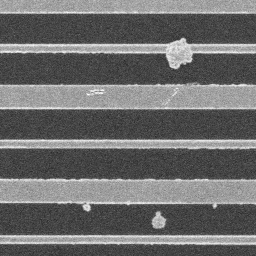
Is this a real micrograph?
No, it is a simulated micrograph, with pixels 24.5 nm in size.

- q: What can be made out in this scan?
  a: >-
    lines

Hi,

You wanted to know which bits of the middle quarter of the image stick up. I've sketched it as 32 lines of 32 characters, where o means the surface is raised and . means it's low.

...........................oo...
................................
................................
................................
................................
oooooooooooooooooooooooooooooooo
oooooooooooooooooooooooooooooooo
oooooooooooooooooooooooooooooooo
oooooooooooooooooooooooooooooooo
oooooooooooooooooooooooooooooooo
oooooooooooooooooooooooooooooooo
................................
................................
................................
................................
................................
................................
................................
................................
oooooooooooooooooooooooooooooooo
oooooooooooooooooooooooooooooooo
................................
................................
................................
................................
................................
................................
................................
................................
oooooooooooooooooooooooooooooooo
oooooooooooooooooooooooooooooooo
oooooooooooooooooooooooooooooooo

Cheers